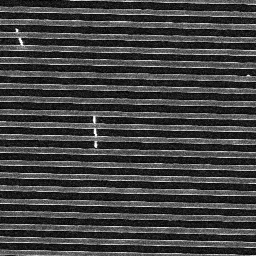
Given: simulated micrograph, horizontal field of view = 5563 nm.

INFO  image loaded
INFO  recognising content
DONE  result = parallel lines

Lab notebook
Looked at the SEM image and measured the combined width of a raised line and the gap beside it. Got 0.278 um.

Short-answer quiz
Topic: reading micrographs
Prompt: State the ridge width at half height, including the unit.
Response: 122 nm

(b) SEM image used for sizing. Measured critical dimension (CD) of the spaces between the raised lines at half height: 163 nm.